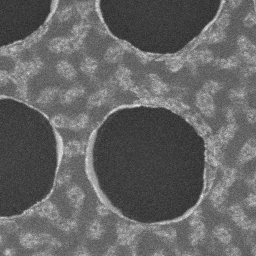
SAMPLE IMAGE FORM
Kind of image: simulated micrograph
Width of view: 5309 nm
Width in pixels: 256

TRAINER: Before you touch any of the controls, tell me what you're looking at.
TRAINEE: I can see holes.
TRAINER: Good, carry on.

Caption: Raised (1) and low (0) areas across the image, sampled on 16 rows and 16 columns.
0001110000000011
0001111000000111
0111111100001111
1111111111111111
1111111111111111
1111111111111111
0011111111111111
0001111000001111
0000110000000111
0000110000000111
0000110000000111
0001110000000111
0001110000001111
0111111100011111
1111111111111111
1111111111111111